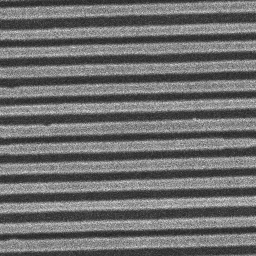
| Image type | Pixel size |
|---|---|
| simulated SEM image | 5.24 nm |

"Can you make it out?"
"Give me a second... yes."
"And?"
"parallel lines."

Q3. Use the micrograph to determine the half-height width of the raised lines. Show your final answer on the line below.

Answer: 53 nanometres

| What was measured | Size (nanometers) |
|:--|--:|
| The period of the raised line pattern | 102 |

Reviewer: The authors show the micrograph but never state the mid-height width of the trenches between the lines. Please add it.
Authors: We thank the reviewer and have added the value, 48.5 nm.